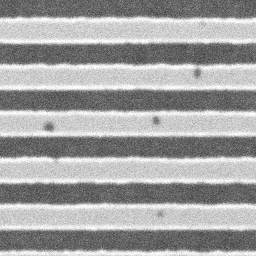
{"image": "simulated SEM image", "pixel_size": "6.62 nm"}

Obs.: lines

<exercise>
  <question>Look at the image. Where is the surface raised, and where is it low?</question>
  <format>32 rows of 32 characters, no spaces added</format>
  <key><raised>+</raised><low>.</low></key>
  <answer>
................................
................................
++++++++++++++++++++++++++++++++
++++++++++++++++++++++++++++++++
++++++++++++++++++++++++++++++++
................................
................................
................................
++++++++++++++++++++++++++++++++
++++++++++++++++++++++++++++++++
++++++++++++++++++++++++++++++++
................................
................................
................................
++++++++++++++++++++++++++++++++
++++++++++++++++++++++++++++++++
++++++++++++++++++++++++++++++++
................................
................................
................................
++++++++++++++++++++++++++++++++
++++++++++++++++++++++++++++++++
++++++++++++++++++++++++++++++++
................................
................................
................................
++++++++++++++++++++++++++++++++
++++++++++++++++++++++++++++++++
++++++++++++++++++++++++++++++++
................................
................................
.+.++...+++.+++......+++...+....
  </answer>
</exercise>